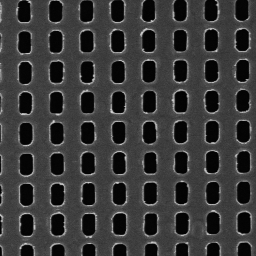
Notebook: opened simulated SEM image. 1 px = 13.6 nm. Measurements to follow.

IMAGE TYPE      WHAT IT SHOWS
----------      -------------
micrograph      a regular array of holes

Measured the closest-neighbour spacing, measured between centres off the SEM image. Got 0.413 microns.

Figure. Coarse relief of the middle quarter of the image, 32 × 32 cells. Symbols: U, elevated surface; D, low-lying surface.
UUUUDDDUUUUUDDDUUUUUDDDUUUUUDDDU
UUUUDDDDUUUUDDDUUUUDDDDUUUUDDDDU
UUUUDDDUUUUUDDDUUUUDDDDUUUUUDDDU
UUUUDDDUUUUUDDDUUUUUDDDUUUUUDDDU
UUUUUDDUUUUUDDDUUUUUDDUUUUUUDDUU
UUUUUUUUUUUUUUUUUUUUUUUUUUUUUUUU
UUUUUUUUUUUUUUUUUUUUUUUUUUUUUUUU
UUUUUDDUUUUUDDDUUUUUDDDUUUUUDDDU
UUUUDDDDUUUUDDDUUUUUDDDUUUUDDDDU
UUUUDDDDUUUUDDDUUUUUDDDUUUUDDDDU
UUUUDDDDUUUUDDDUUUUUDDDUUUUDDDDU
UUUUDDDUUUUUDDDUUUUUDDDUUUUUDDDU
UUUUUUUUUUUUUUUUUUUUUUUUUUUUUUUU
UUUUUUUUUUUUUUUUUUUUUUUUUUUUUUUU
UUUUUUDUUUUUUDUUUUUUUDUUUUUUDDUU
UUUUDDDUUUUUDDDUUUUUDDDUUUUUDDDU
UUUUDDDDUUUUDDDUUUUUDDDUUUUUDDDU
UUUUDDDDUUUUDDDUUUUUDDDUUUUUDDDU
UUUUDDDDUUUUDDDUUUUUDDDUUUUUDDDU
UUUUUDDUUUUUUDDUUUUUDDDUUUUUDDUU
UUUUUUUUUUUUUUUUUUUUUUUUUUUUUUUU
UUUUUUUUUUUUUUUUUUUUUUUUUUUUUUUU
UUUUUDDUUUUUUDDUUUUUDDDUUUUUDDDU
UUUUDDDDUUUUDDDUUUUUDDDUUUUUDDDU
UUUUDDDDUUUUDDDUUUUUDDDUUUUUDDDU
UUUUDDDDUUUUDDDDUUUUDDDUUUUUDDDU
UUUUDDDDUUUUDDDDUUUUDDDUUUUUDDDU
UUUUUDUUUUUUUDUUUUUUUDUUUUUUUUUU
UUUUUUUUUUUUUUUUUUUUUUUUUUUUUUUU
UUUUUUUUUUUUUUUUUUUUUUUUUUUUUDUU
UUUUUDDDUUUUDDDUUUUUDDDUUUUUDDDU
UUUUUDDDUUUUDDDDUUUUDDDUUUUUDDDU